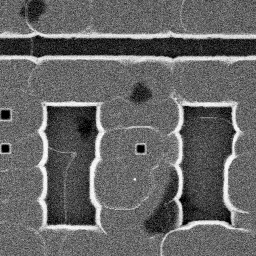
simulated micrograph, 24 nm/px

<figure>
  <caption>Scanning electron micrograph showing wiring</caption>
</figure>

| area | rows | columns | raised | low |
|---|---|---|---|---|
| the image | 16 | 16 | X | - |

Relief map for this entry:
XXXXXXXXXXXXXXXX
XXXXXXXXXXXXXXXX
----------------
----------------
XXXXXXXXXXXXXXXX
XXXXXXXXXXXXXXXX
XXXX-XXXXXXXXXXX
XXX---XXXXX----X
XXX---XXXXX----X
XXX---XXXXX----X
XXX---XXXXX---XX
XXX---XXXXX---XX
XXX---XXXXX---XX
XXX---XXXXX----X
XXXXXXXXXXXXXXXX
XXXXXXXXXXXXXXXX